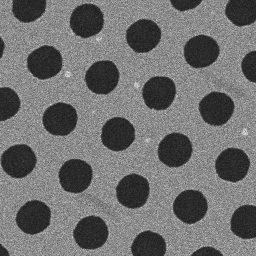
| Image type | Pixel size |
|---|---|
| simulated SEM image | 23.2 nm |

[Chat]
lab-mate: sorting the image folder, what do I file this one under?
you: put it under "a regular array of holes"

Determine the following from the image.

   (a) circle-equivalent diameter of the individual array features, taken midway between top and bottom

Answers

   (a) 807 nm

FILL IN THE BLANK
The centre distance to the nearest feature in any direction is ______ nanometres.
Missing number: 1360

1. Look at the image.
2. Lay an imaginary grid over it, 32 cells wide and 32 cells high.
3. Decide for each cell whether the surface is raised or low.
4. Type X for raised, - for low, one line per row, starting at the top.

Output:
XX----XXXXX-XXXXXXXXX----XXX----
XX----XXX----XXXXXXXXXXXXXXX----
XX--XXXXX----XXXX--XXXXXXXXXX---
XXXXXXXXX----XXX----XXXXXXXXXXXX
XXXXXXXXXX--XXXX----XXXX--XXXXXX
-XXXXXXXXXXXXXXX----XXX----XXXXX
XXXX---XXXXXXXXXX-XXXXX----XXXX-
XXX-----XXXXXXXXXXXXXXX----XXX--
XXX-----XXX----XXXXXXXXX-XXXXX--
XXXX---XXXX----XXXXXXXXXXXXXXXX-
XXXXXXXXXXX----XXX----XXXXXXXXXX
--XXXXXXXXXX--XXXX----XXXX--XXXX
---XXXXXXXXXXXXXXX----XXX----XXX
--XXXX---XXXXXXXXXX--XXXX----XXX
--XXX-----XXXXXXXXXXXXXXX----XXX
XXXXX-----XXX---XXXXXXXXXX--XXXX
XXXXXX---XXXX----XXXXXXXXXXXXXXX
XXXXXXXXXXXXX----XXX----XXXXXXXX
X---XXXXXXXXX---XXXX----XXXXXXXX
----XXXXXXXXXXXXXXXX----XXX----X
-----XXX---XXXXXXXXXX--XXXX----X
X---XXX-----XXXXXXXXXXXXXXX----X
XXXXXXX----XXXX---XXXXXXXXXX--XX
XXXXXXXX---XXXX----XXXXXXXXXXXXX
XXXXXXXXXXXXXXX----XXX----XXXXXX
XXX---XXXXXXXXX---XXXX----XXXXXX
XX----XXXXXXXXXXXXXXXX----XXX---
XX----XXXX---XXXXXXXXXX--XXXX---
XX----XXX----XXXXXXXXXXXXXXXX---
XXXXXXXXX-----XXX---XXXXXXXXXX--
XXXXXXXXXX---XXX-----XXXXXXXXXXX
-XXXXXXXXXXXXXXX-----XXX---XXXXX